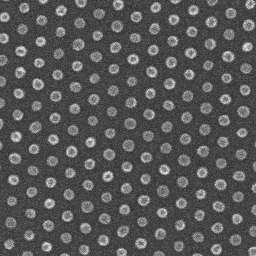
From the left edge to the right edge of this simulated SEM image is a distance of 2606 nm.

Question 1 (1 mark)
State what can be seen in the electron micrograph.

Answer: a regular array of raised bodies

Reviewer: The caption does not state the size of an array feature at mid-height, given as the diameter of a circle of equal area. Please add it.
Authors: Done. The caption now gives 0.103 microns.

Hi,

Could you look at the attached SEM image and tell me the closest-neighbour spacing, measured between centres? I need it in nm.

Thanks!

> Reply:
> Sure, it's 216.